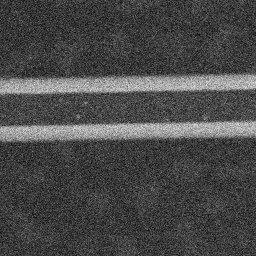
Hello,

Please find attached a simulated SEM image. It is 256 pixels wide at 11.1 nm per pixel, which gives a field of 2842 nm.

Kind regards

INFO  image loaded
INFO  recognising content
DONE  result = one or a few lines or trenches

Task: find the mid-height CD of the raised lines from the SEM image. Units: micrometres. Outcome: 0.501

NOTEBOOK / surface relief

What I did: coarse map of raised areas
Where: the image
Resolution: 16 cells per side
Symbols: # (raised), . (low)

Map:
................
................
................
................
................
.###############
################
################
................
................
................
................
................
................
................
................